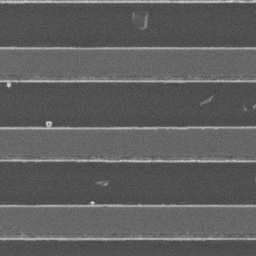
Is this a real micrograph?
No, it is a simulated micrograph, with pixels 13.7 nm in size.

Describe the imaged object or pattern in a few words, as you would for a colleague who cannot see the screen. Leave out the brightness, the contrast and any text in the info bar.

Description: lines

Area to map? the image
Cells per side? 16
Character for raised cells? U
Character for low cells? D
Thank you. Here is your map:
DDDDDDDDDDDDDDDD
DDDDDDDDDDDDDDDD
DDDDDDDDDDDDDDDD
UUUUUUUUUUUUUUUU
UUUUUUUUUUUUUUUU
DDDDDDDDDDDDDDDD
DDDDDDDDDDDDDDDD
DDDDDDDDDDDDDDDD
UUUUUUUUUUUUUUUU
UUUUUUUUUUUUUUUU
DDDDDDDDDDDDDDDD
DDDDDDDDDDDDDDDD
DDDDDDDDDDDDDDDD
UUUUUUUUUUUUUUUU
UUUUUUUUUUUUUUUU
DDDDDDDDDDDDDDDD